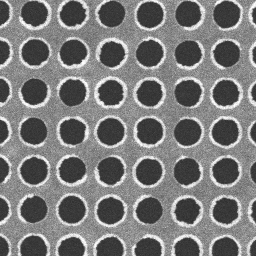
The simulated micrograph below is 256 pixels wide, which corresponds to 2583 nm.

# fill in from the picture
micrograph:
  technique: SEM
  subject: a regular array of holes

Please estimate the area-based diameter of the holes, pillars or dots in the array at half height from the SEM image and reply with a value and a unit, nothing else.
270 nm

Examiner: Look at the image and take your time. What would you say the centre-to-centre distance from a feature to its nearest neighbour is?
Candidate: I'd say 384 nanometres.